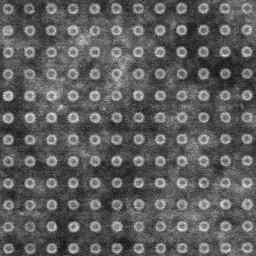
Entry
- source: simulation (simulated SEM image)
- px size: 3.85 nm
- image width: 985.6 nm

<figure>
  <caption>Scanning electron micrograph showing a regular array of raised bodies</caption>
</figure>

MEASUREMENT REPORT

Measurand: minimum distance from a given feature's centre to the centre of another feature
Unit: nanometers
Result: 82.7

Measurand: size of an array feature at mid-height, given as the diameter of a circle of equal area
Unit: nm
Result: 36.8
